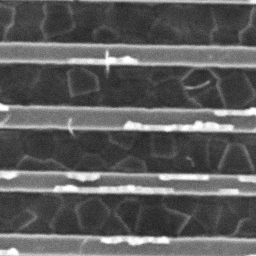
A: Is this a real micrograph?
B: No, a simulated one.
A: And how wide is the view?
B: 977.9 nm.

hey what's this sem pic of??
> one or a few lines or trenches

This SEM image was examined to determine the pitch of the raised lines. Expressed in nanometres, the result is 246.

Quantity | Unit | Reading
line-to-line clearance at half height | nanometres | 167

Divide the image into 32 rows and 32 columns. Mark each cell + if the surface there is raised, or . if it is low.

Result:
................................
................................
................................
................................
................................
++++++..........................
++++++++++++++++++++++++++++++++
++++++++++++++++++++++++++++++++
................................
................................
................................
................................
................................
+++++++++++.....................
++++++++++++++++++++++++++++++++
++++++++++++++++++++++++++++++++
................................
................................
................................
................................
................................
+++.............................
++++++++++++++++++++++++++++++++
++++++++++++++++++++++++++++++++
................................
................................
................................
................................
................................
++++++++........................
++++++++++++++++++++++++++++++++
++++++++++++++++++++++++++++++++